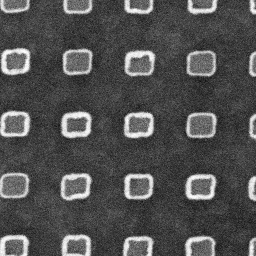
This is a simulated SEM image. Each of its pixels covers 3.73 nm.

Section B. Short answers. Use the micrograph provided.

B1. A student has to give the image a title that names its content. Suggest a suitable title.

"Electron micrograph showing a regular array of raised bodies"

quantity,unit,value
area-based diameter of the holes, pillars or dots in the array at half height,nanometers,103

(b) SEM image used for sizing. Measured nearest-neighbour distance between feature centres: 0.23 micrometres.